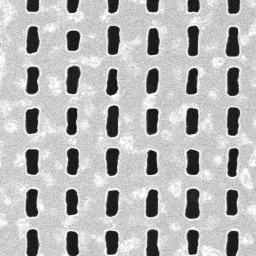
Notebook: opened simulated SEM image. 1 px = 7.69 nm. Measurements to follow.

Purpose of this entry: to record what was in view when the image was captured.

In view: a regular array of holes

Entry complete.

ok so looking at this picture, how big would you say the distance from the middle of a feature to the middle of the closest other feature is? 304 nm